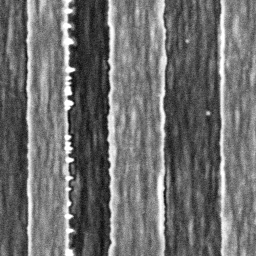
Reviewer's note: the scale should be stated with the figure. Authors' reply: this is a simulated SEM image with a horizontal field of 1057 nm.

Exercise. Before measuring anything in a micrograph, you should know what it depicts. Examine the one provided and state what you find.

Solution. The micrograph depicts lines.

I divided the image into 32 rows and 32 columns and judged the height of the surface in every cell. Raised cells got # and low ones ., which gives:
....#####.....#######.......####
....#####.....######........####
....####......######........####
....#####.....#######.......####
....#####.....#######.......####
...######.....#######.......####
....#####.....#######.......####
....#####.....#######.......####
....#####.....#######.......####
....#####.....#######.......####
...######.....#######.......####
...######.....#######.......####
....#####.....######........####
....#####.....######........####
...#####......#######.......####
....####......#######.......####
....####......#######.......####
....#####.....######........####
....#####.....######........####
....#####.....######........####
....#####.....#######.......####
....####......#######.......####
....#####.....######........####
....#####.....######........####
....####......######........####
....#####.....#######.......####
....#####.....#######.......####
....#####.....#######.......####
....#####.....#######.......####
....#####.....#######.......####
....####......#######.......####
....#####.....#######.......####